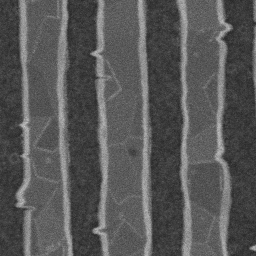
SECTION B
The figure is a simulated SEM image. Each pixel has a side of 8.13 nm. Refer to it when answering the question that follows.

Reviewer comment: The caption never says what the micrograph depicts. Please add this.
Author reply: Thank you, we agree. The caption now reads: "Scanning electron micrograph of one or a few lines or trenches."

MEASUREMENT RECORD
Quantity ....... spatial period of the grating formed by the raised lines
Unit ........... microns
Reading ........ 0.646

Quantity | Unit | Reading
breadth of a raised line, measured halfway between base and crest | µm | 0.324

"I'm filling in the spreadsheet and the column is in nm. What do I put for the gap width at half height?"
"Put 317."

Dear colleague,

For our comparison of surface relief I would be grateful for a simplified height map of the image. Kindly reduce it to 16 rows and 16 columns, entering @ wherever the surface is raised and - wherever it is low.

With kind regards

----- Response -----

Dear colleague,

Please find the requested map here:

-@@@--@@@--@@@--
-@@@--@@@--@@@--
-@@@--@@@---@@--
-@@@--@@@--@@@--
--@@--@@@--@@@--
--@@--@@@---@@--
--@@--@@@--@@@--
--@@--@@@---@@--
--@@--@@@---@@--
--@@--@@@--@@@--
--@@---@@---@@--
--@@--@@@---@@--
-@@@--@@@---@@--
--@@--@@@---@@--
--@@--@@@---@@--
--@@---@@---@@--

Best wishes